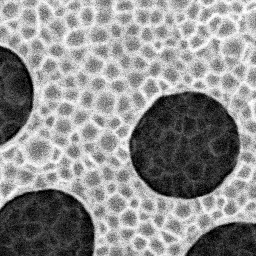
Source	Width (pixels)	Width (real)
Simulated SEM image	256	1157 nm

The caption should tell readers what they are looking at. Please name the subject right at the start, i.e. holes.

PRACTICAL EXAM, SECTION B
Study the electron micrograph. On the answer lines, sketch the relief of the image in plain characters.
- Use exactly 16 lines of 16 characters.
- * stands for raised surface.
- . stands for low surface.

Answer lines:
****************
****************
****************
.***************
..**************
..**************
..********....**
..*******......*
.*******.......*
********.......*
********.......*
*********.....**
*....******.****
......**********
......*******...
......******....